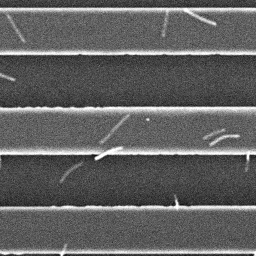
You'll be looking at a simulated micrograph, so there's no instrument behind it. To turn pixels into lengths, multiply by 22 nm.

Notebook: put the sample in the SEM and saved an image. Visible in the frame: lines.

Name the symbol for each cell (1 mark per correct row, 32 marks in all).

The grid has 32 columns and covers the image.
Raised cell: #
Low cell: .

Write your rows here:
................................
################################
################################
################################
################################
################################
################################
................................
................................
................................
................................
................................
................................
.......#......##.##...#.########
################################
################################
################################
################################
################################
............#...................
................................
................................
................................
................................
................................
................................
################################
################################
################################
################################
################################
################################